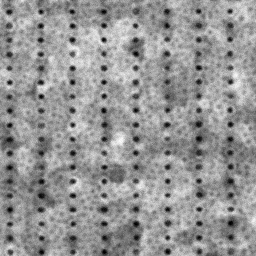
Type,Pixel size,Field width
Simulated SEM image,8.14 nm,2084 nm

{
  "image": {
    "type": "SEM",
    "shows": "a regular array of holes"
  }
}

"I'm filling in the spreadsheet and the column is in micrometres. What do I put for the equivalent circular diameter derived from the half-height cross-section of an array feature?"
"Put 0.0595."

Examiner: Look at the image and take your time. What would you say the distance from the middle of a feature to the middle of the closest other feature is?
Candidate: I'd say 13.9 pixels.